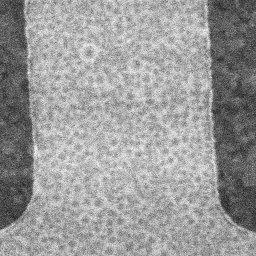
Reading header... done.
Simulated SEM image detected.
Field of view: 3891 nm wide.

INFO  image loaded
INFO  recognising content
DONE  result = one or a few lines or trenches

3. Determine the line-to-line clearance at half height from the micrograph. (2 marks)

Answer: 179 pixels